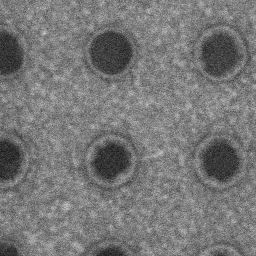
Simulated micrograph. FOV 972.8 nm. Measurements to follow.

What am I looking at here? raised bodies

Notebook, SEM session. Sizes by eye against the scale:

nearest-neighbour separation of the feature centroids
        0.411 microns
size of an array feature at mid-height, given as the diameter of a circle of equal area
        190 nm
